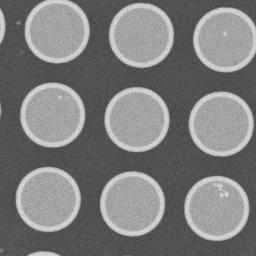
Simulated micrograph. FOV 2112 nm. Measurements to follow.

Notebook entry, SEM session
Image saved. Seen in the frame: an array of small figures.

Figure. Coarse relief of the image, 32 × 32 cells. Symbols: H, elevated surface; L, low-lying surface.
LLLLLHHHHLLLLLLLLHHLLLLLLLLLLLLL
LLLLHHHHHHLLLLLHHHHHHLLLLLHHHHLL
HLLHHHHHHHHLLLHHHHHHHLLLLHHHHHHL
HLLHHHHHHHHLLLHHHHHHHHLLHHHHHHHH
LLLHHHHHHHHLLLHHHHHHHHLLHHHHHHHH
LLLHHHHHHHHLLLHHHHHHHHLLHHHHHHHH
LLLLHHHHHHLLLLHHHHHHHLLLHHHHHHHH
LLLLLHHHHLLLLLLHHHHHLLLLLHHHHHHL
LLLLLLLLLLLLLLLLLLLLLLLLLLHHHHLL
LLLLLLLLLLLLLLLLLLLLLLLLLLLLLLLL
LLLLLLHHLLLLLLLLLLLLLLLLLLLLLLLL
LLLLHHHHHLLLLLLHHHHLLLLLLLLHLLLL
LLLHHHHHHHLLLLHHHHHHLLLLLHHHHHLL
LLLHHHHHHHHLLHHHHHHHHLLLHHHHHHHL
LLLHHHHHHHHLLHHHHHHHHLLLHHHHHHHH
LLLHHHHHHHLLLHHHHHHHHLLLHHHHHHHH
LLLHHHHHHHLLLHHHHHHHHLLLHHHHHHHH
LLLLHHHHHLLLLLHHHHHHLLLLHHHHHHHL
LLLLLLLLLLLLLLLHHHHLLLLLLHHHHHLL
LLLLLLLLLLLLLLLLLLLLLLLLLLLLLLLL
LLLLLLLLLLLLLLLLLLLLLLLLLLLLLLLL
LLLLHHHHLLLLLLLLHLLLLLLLLLLLLLLL
LLLHHHHHHLLLLLHHHHHLLLLLLHHHHLLL
LLHHHHHHHHLLLHHHHHHHLLLLHHHHHHLL
LLHHHHHHHHLLLHHHHHHHLLLHHHHHHHHL
LLHHHHHHHHLLLHHHHHHHHLLHHHHHHHHL
LLHHHHHHHHLLLHHHHHHHLLLHHHHHHHHL
LLLHHHHHHLLLLHHHHHHHLLLHHHHHHHHL
LLLLHHHHLLLLLLHHHHHLLLLLHHHHHHLL
LLLLLLLLLLLLLLLLHLLLLLLLLHHHHLLL
LLLLLLLLLLLLLLLLLLLLLLLLLLLLLLLL
LLLLLHLLLLLLLLLLLLLLLLLLLLLLLLLL